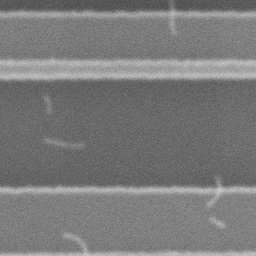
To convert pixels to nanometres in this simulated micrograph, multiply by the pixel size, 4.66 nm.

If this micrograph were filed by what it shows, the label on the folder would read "lines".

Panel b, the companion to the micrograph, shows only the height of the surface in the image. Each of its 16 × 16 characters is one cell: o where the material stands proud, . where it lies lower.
................
oooooooooooooooo
oooooooooooooooo
oooooooooooooooo
oooooooooooooooo
................
................
................
................
................
................
................
oooooooooooooooo
oooooooooooooooo
oooooooooooooooo
oooooooooooooooo